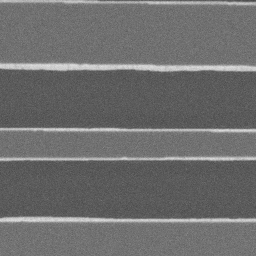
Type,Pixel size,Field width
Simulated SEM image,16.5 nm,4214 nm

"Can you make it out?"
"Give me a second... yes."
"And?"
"lines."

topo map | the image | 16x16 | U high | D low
UUUUUUUUUUUUUUUU
UUUUUUUUUUUUUUUU
UUUUUUUUUUUUUUUU
UUUUUUUUUUUUUUUU
DDDDDDDDDDDDDDDD
DDDDDDDDDDDDDDDD
DDDDDDDDDDDDDDDD
DDDDDDDDDDDDDDDD
UUUUUUUUUUUUUUUU
UUUUUUUUUUUUUUUU
DDDDDDDDDDDDDDDD
DDDDDDDDDDDDDDDD
DDDDDDDDDDDDDDDD
DDDDDDDDDDDDDDDD
UUUUUUUUUUUUUUUU
UUUUUUUUUUUUUUUU